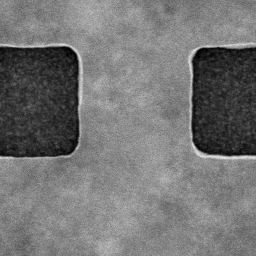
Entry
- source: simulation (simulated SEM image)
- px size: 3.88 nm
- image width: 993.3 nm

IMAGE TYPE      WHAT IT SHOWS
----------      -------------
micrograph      holes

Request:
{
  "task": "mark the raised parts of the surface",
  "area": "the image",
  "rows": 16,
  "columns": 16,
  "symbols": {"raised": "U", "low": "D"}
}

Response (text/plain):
UUUUUUUUUUUUUUUU
UUUUUUUUUUUUUUUU
UUUUUUUUUUUUUUUU
DDDDDUUUUUUUDDDD
DDDDDUUUUUUUDDDD
DDDDDUUUUUUUDDDD
DDDDDUUUUUUUDDDD
DDDDDUUUUUUUDDDD
DDDDDUUUUUUUDDDD
DDDDUUUUUUUUUDDD
UUUUUUUUUUUUUUUU
UUUUUUUUUUUUUUUU
UUUUUUUUUUUUUUUU
UUUUUUUUUUUUUUUU
UUUUUUUUUUUUUUUU
UUUUUUUUUUUUUUUU